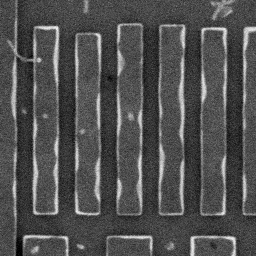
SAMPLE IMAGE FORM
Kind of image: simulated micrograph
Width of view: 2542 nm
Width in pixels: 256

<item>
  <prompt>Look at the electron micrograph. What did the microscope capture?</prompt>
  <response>groups of lines, slits or small figures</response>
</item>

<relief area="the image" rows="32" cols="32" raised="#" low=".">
##..............................
##..............................
##..............................
##...##........###..###.........
##..###...##...###..###..###...#
##..###...##...###..###..###...#
##..###...##...###..###..###...#
##..###...##...###..###..###...#
##..###...##...###..###..###...#
##..###...##...###..###..###...#
##..###...##...###..###..###...#
##..###...##...###..###..###...#
##..###...##...###..###..###..##
##..###...##...###..###..###..##
##..###...##...##...###..###..##
##..###...##...###..###..###...#
##..###...##...###..###..###..##
##..###...##...###..###..###..##
##..###...##...###..###..###..##
##..###...##...###..###..###..##
##..###...##...##...###..###..##
##..###...##...##...###..###..##
##..###...##...##...###..###...#
##..###...##...##...###..###...#
##..###...##...###..###..###...#
##..###...##...###..###..###..##
##..###...##...##...###..###...#
##..............................
##..............................
##..............................
##.#####.....######.....#####...
##.#####.....######.....#####...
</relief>